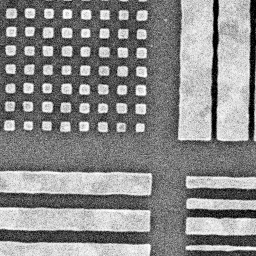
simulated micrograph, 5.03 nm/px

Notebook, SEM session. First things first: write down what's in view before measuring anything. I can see groups of lines, slits or small figures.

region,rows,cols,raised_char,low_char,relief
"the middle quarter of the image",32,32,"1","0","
00000000000000000000000000000111
11001100011000110011000000000111
00001100011000110011000000000111
00000000000000000000000000000111
00000000000000000000000000000111
11001100011000000000000000000111
11001100011000110011000000000111
00000000000000000011000000000111
00000000000000000000000000000111
00000000000000000000000000000111
10001100011001110011000000000111
10001100011001110011000000000111
00000000000000000000000000000111
00000000000000000000000000000111
00000000000000000000000000000111
10001100011000100011000000000111
10001100011000100011000000000111
00000000000000000000000000000111
00000000000000000000000000000111
00000000000000000000000000000000
00000000000000000000000000000000
00000000000000000000000000000000
00000000000000000000000000000000
00000000000000000000000000000000
00000000000000000000000000000000
00000000000000000000000000000000
00000000000000000000000000000000
11111111111111110000000000000000
11111111111111111111110000000001
11111111111111111111110000000001
11111111111111111111110000000001
11111111111111111111110000000000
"